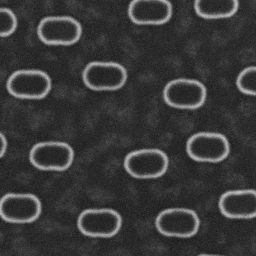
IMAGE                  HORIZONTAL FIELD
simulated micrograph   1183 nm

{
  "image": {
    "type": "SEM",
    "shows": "a regular array of raised bodies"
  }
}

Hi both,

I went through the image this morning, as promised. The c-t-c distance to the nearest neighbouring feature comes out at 294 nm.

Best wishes